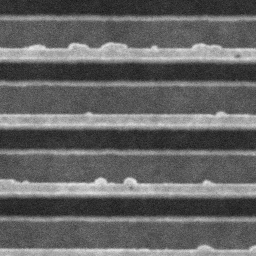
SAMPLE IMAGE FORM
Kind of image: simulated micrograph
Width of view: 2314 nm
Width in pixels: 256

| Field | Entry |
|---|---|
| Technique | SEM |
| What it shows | lines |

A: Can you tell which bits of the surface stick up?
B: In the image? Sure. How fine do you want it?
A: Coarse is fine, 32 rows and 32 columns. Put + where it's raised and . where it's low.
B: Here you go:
................................
................................
++++++++++++++++++++++++++++++++
++++++++++++++++++++++++++++++++
++++++++++++++++++++++++++++++++
++++++++++++++++++++++++++++++++
++++++++++++++++++++++++++++++++
................................
................................
................................
+..++..+........................
++++++++++++++++++++++++++++++++
++++++++++++++++++++++++++++++++
++++++++++++++++++++++++++++++++
++++++++++++++++++++++++++++++++
++++++++++++++++++++++++++++++++
................................
................................
................................
++++++++++++++++++++++++++++++++
++++++++++++++++++++++++++++++++
++++++++++++++++++++++++++++++++
++++++++++++++++++++++++++++++++
++++++++++++++++++++++++++++++++
................................
................................
................................
+++....++...............+.......
++++++++++++++++++++++++++++++++
++++++++++++++++++++++++++++++++
++++++++++++++++++++++++++++++++
++++++++++++++++++++++++++++++++